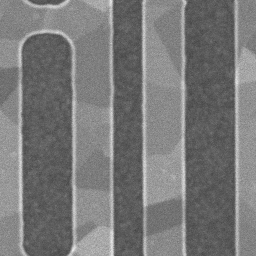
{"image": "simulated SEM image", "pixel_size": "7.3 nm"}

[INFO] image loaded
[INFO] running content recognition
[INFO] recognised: one or a few lines or trenches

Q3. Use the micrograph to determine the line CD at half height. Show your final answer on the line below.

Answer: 287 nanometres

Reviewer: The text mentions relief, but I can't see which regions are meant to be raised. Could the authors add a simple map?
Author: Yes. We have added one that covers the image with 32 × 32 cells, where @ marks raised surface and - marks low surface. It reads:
@@@@----@@@@@@----@@@@@-------@@
@@@@@@@@@@@@@@----@@@@@-------@@
@@@@@@@@@@@@@@----@@@@@-------@@
@@@@@@@@@@@@@@----@@@@@-------@@
@@@@----@@@@@@----@@@@@-------@@
@@@------@@@@@----@@@@@-------@@
@@-------@@@@@----@@@@@-------@@
@@-------@@@@@----@@@@@-------@@
@@@------@@@@@----@@@@@-------@@
@@@------@@@@@----@@@@@-------@@
@@@------@@@@@----@@@@@-------@@
@@@------@@@@@----@@@@@-------@@
@@@------@@@@@----@@@@@-------@@
@@@------@@@@@----@@@@@-------@@
@@@------@@@@@----@@@@@-------@@
@@@------@@@@@----@@@@@-------@@
@@@------@@@@@----@@@@@-------@@
@@@------@@@@@----@@@@@-------@@
@@@------@@@@@----@@@@@-------@@
@@@------@@@@@----@@@@@-------@@
@@@------@@@@@----@@@@@-------@@
@@@------@@@@@----@@@@@-------@@
@@@------@@@@@----@@@@@-------@@
@@@------@@@@@----@@@@@-------@@
@@@------@@@@@----@@@@@-------@@
@@@------@@@@@----@@@@@-------@@
@@@------@@@@@----@@@@@-------@@
@@@------@@@@@----@@@@@-------@@
@@@------@@@@@----@@@@@-------@@
@@@------@@@@@----@@@@@-------@@
@@@------@@@@@----@@@@@-------@@
@@@------@@@@@----@@@@@-------@@